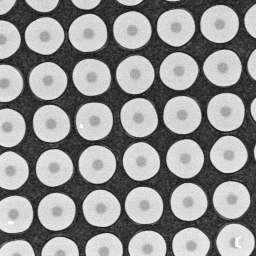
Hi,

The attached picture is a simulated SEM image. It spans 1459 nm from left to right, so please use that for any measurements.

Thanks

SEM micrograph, an array of small figures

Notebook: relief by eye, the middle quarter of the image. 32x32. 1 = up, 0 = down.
00011111111000111111110011111111
00111111111001111111110011111111
00111111111101111111111011111111
10111111111101111111111011111111
10111111111101111111110001111111
10011111111000111111110000111111
00001111111000011111100000000000
00000111100000000000000000000000
00000000000000000000000000011111
00000000000000001111110000111111
00000111111000011111110001111111
00001111111100111111111001111111
10011111111100111111111001111111
10011111111100111111111001111111
10011111111100111111111001111111
10011111111100011111111000111111
10011111111100011111111000011111
10001111111000001111100000000010
00000111110000000000000000000000
00000000000000000000000000001111
00000001100000000111110000011111
00000111111000001111111000111111
10001111111100011111111000111111
10001111111110011111111100111111
11001111111110011111111100111111
11001111111110011111111100111111
11001111111110011111111100111111
11001111111100001111111000001111
11000111111100000111110000000010
00000001110000000000000000000000
00000000000000000000000000000111
00000000010000000111111000001111